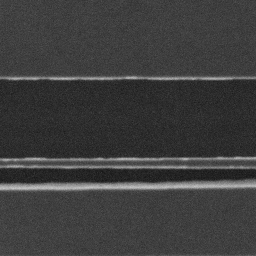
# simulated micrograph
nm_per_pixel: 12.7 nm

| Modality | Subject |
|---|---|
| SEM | lines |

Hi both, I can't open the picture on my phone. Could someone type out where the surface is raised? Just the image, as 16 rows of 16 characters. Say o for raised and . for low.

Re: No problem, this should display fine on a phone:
oooooooooooooooo
oooooooooooooooo
oooooooooooooooo
oooooooooooooooo
oooooooooooooooo
................
................
................
................
................
oooooooooooooooo
oooooooooooooooo
oooooooooooooooo
oooooooooooooooo
oooooooooooooooo
oooooooooooooooo